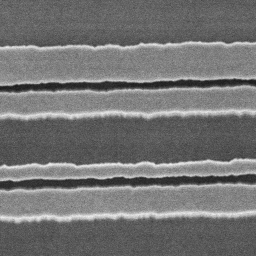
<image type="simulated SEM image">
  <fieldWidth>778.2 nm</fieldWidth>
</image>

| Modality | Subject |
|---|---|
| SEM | lines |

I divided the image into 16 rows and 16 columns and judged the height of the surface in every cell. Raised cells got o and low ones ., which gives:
................
................
................
oooooooooooooooo
oooooooooooooooo
oooooooooooooooo
oooooooooooooooo
................
................
................
oooooooooooooooo
oooooooooooooooo
oooooooooooooooo
ooooooo.o.......
................
................